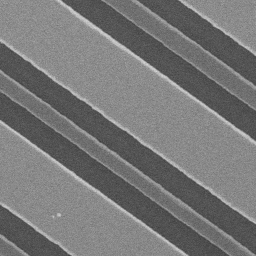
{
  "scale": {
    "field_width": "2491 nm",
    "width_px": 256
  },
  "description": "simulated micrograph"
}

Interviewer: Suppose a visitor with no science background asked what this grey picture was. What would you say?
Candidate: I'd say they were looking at lines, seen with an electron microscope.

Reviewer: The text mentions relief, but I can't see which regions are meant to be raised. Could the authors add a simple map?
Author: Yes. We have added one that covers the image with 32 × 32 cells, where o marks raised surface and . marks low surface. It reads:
oooooooo.....ooooo.....ooooooooo
ooooooooo......oooo.....oooooooo
ooooooooooo.....oooo......oooooo
oooooooooooo......oooo.....ooooo
oooooooooooooo.....oooo......ooo
.oooooooooooooo.....ooooo.....oo
..oooooooooooooo......oooo.....o
...ooooooooooooooo.....oooo.....
.....oooooooooooooo......oooo...
o.....oooooooooooooo......oooo..
oo.....ooooooooooooooo.....oooo.
oooo.....oooooooooooooo......ooo
..ooo.....ooooooooooooooo.....oo
...oooo.....oooooooooooooo......
....oooo.....oooooooooooooo.....
o.....ooo.....ooooooooooooooo...
oo.....oooo.....oooooooooooooo..
ooo......ooo.....ooooooooooooooo
ooooo.....ooo......ooooooooooooo
oooooo.....oooo.....oooooooooooo
ooooooo......ooo.....ooooooooooo
ooooooooo.....oooo.....ooooooooo
oooooooooo......ooo.....oooooooo
oooooooooooo.....ooo......oooooo
ooooooooooooo.....oooo.....ooooo
oooooooooooooo......ooo.....oooo
.ooooooooooooooo.....ooo......oo
...oooooooooooooo.....oooo.....o
....ooooooooooooooo.....ooo.....
......oooooooooooooo.....oooo...
oo.....oooooooooooooo......ooo..
ooo.....ooooooooooooooo.....ooo.